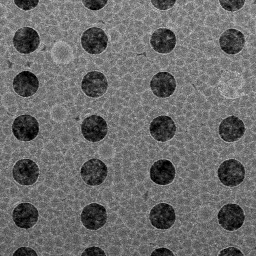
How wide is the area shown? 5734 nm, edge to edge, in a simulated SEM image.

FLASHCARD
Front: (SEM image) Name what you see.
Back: a regular array of holes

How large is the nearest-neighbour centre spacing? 980 nm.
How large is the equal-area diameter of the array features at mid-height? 608 nanometres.